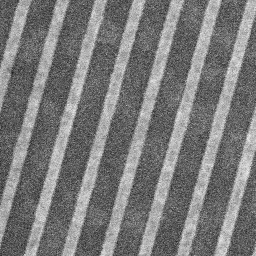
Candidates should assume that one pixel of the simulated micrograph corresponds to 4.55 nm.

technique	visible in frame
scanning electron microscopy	parallel lines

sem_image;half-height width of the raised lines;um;0.0482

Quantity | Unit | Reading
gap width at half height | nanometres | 121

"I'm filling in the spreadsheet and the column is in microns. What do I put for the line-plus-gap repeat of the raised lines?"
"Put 0.167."